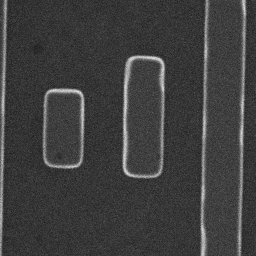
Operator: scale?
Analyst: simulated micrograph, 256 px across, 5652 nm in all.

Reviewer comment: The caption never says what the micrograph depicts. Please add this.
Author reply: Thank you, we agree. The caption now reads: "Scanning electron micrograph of groups of lines, slits or small figures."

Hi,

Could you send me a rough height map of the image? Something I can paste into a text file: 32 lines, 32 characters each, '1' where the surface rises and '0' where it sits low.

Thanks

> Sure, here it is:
10000000000000000000000000111110
10000000000000000000000000111110
10000000000000000000000000111110
10000000000000000000000000111110
10000000000000000000000000111110
10000000000000000000000000111110
10000000000000000000000000111110
10000000000000001111000000111110
10000000000000001111000000111110
10000000000000001111000000111110
00000000000000001111000000111100
00000011110000001111000000111100
00000011110000001111000000111100
00000011110000001111000000111100
00000011110000001111000000111100
00000011110000001111000000111100
00000011110000001111000001111100
00000011110000001111000001111100
00000011110000001111000001111100
00000011110000001111000001111100
00000011110000011111000001111100
00000000000000001111000001111100
00000000000000000000000001111100
00000000000000000000000001111100
00000000000000000000000001111100
00000000000000000000000001111100
00000000000000000000000001111100
00000000000000000000000001111100
00000000000000000000000001111100
00000000000000000000000001111100
00000000000000000000000001111100
00000000000000000000000001111100